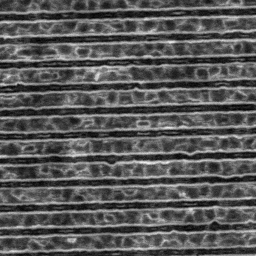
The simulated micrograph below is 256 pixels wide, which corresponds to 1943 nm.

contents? parallel lines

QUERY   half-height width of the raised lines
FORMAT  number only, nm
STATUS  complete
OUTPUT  125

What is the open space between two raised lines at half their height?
58.8 nanometres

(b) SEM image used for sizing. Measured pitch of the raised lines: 181 nm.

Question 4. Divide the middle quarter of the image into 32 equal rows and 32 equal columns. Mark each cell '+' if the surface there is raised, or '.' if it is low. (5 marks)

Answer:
................++..+...++++++++
++++++++++++++++++++++++++++++++
++++++++++++++++++++++++++++++++
++++++++++++++++++++++++++++++++
++++++++++++...++..+++..........
................................
.................++.+...++++++++
++++++++++++++++++++++++++++++++
++++++++++++++++++++++++++++++++
++++++++++++++++++++++++++++++++
++++++++..+++++.................
................................
.......................+++++++++
++++++++++++++++++++++++++++++++
++++++++++++++++++++++++++++++++
++++++++++++++++++++++++++++++++
+++++++++.+.....................
................................
.................++....+++++++++
++++++++++++++++++++++++++++++++
++++++++++++++++++++++++++++++++
++++++++++++++++++++++++++++++++
++++++++++++.+++..............++
................................
.................++.++++++++++++
++++++++++++++++++++++++++++++++
++++++++++++++++++++++++++++++++
++++++++++++++++++++++++++++++++
++++++++++..++++................
................................
...............++++...++++++++++
++++++++++++++++++++++++++++++++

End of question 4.